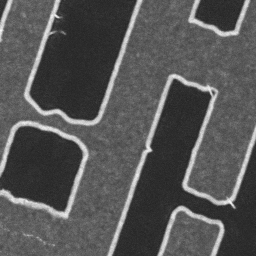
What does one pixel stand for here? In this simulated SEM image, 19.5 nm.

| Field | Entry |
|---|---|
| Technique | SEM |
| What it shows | one or a few lines or trenches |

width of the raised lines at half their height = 1050 nanometers